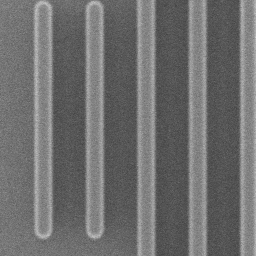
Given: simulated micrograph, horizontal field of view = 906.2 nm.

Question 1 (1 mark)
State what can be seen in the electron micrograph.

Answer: groups of lines, slits or small figures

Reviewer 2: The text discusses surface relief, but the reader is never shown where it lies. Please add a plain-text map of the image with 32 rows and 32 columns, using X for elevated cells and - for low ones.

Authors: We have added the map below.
-----X-----XX----XX-----XX----XX
----XX-----XX----XX-----XX----XX
----XX-----XX----XX-----XX----XX
----XX-----XX----XX-----XX----XX
----XX-----XX----XX-----XX----XX
----XX-----XX----XX-----XX----XX
----XX-----XX----XX-----XX----XX
----XX-----XX----XX-----XX----XX
----XX-----XX----XX-----XX----XX
----XX-----XX----XX-----XX----XX
----XX-----XX----XX-----XX----XX
----XX-----XX----XX-----XX----XX
----XX-----XX----XX-----XX----XX
----XX-----XX----XX-----XX----XX
----XX-----XX----XX-----XX----XX
----XX-----XX----XX-----XX----XX
----XX-----XX----XX-----XX----XX
----XX-----XX----XX-----XX----XX
----XX-----XX----XX-----XX----XX
----XX-----XX----XX-----XX----XX
----XX-----XX----XX-----XX----XX
----XX-----XX----XX-----XX----XX
----XX-----XX----XX-----XX----XX
----XX-----XX----XX-----XX----XX
----XX-----XX----XX-----XX----XX
----XX-----XX----XX-----XX----XX
----XX-----XX----XX-----XX----XX
----XX-----XX----XX-----XX----XX
----XX-----XX----XX-----XX----XX
-----X-----X-----XX-----XX----XX
-----------------XX-----XX----XX
-----------------XX-----XX----XX